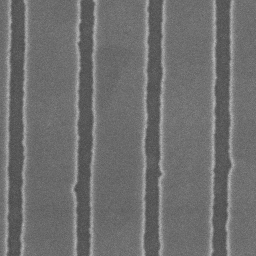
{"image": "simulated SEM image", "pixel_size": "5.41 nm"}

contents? one or a few lines or trenches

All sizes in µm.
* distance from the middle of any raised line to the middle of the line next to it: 0.369